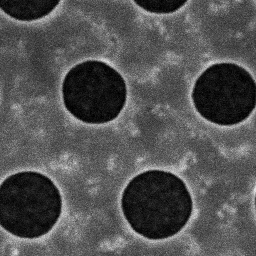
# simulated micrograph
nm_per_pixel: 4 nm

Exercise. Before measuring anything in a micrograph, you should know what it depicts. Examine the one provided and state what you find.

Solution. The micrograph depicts holes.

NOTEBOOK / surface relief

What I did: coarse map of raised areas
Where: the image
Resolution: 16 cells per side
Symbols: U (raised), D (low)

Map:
DDDUUUUUUDDUUUUU
UUUUUUUUUUUUUUUU
UUUUUUUUUUUUUUUU
UUUUUUUUUUUUUUUU
UUUUDDDUUUUUUDDU
UUUUDDDDUUUUDDDD
UUUUDDDDUUUUDDDD
UUUUUDDUUUUUUDDU
UUUUUUUUUUUUUUUU
UUUUUUUUUUUUUUUU
UUUUUUUUUUUUUUUU
DDDUUUUUDDDDUUUU
DDDDUUUUDDDDUUUU
DDDDUUUUDDDDUUUU
UDDUUUUUUDDUUUUU
UUUUUUUUUUUUUUUU